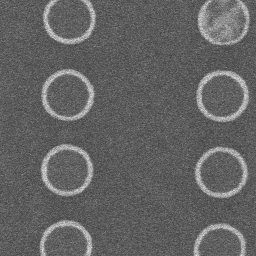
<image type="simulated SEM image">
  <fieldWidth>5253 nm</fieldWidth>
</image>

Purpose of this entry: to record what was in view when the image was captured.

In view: raised bodies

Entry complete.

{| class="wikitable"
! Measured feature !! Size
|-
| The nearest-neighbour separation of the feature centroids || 1.55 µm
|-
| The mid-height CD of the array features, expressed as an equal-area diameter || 983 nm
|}